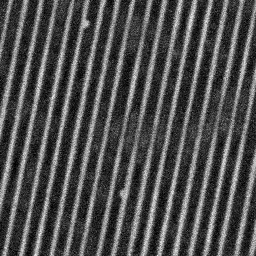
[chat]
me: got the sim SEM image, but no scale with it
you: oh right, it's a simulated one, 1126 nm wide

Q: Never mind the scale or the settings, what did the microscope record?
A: parallel lines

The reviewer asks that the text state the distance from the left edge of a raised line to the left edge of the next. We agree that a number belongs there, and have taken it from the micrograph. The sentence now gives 66.5 nm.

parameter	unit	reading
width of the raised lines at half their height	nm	15.1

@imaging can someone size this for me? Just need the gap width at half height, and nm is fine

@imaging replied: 49